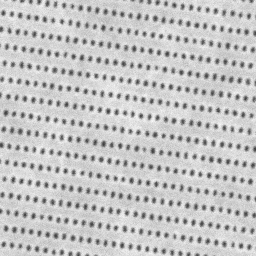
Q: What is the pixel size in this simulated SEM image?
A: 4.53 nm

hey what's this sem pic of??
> a regular array of holes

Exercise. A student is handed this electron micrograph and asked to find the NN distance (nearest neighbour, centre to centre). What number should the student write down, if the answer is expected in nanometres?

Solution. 36.9